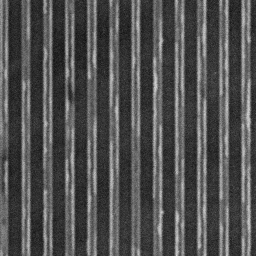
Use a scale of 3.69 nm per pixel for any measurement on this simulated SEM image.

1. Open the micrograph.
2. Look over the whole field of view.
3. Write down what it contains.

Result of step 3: parallel lines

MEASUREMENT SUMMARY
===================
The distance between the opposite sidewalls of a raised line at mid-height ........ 32.8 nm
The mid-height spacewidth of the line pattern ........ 48.9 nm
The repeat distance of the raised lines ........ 81.3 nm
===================